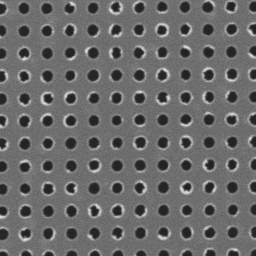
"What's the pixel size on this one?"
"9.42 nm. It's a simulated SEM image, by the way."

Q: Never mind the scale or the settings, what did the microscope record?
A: a regular array of holes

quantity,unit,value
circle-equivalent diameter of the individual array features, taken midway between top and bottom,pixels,10.9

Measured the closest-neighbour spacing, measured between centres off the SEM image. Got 0.209 µm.